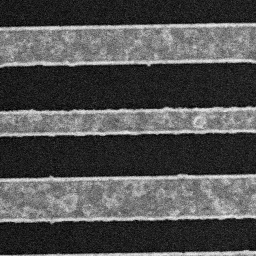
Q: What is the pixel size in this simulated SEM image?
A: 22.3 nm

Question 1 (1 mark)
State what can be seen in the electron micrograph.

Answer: one or a few lines or trenches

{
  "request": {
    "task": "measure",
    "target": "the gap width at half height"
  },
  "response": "1000 nanometers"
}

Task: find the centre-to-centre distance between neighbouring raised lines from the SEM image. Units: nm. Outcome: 1710